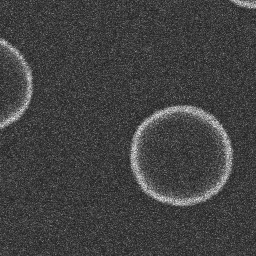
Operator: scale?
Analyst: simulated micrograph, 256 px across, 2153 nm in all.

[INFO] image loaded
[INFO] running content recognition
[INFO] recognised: raised bodies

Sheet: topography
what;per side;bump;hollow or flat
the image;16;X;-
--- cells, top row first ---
----------------
----------------
----------------
X---------------
XX--------------
XX--------------
XX--------------
X--------XXXX---
---------XXXXX--
--------XXXXXX--
--------XXXXXX--
---------XXXXX--
----------XX----
----------------
----------------
----------------